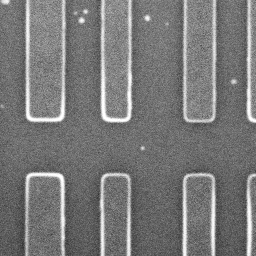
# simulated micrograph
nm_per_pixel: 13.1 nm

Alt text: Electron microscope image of groups of lines, slits or small figures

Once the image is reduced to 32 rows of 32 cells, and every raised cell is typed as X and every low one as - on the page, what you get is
---XXXXX-----XXX-------XXXX----X
---XXXXX-----XXX-------XXXX----X
---XXXXX-----XXX-------XXXX----X
---XXXXX-----XXX-------XXXX----X
---XXXXX-----XXX-------XXXX----X
---XXXXX-----XXX-------XXXX----X
---XXXXX-----XXX-------XXXX----X
---XXXXX-----XXX-------XXXX----X
---XXXXX-----XXX-------XXXX----X
---XXXXX-----XXX-------XXXX----X
---XXXXX-----XXX-------XXXX----X
---XXXXX-----XXX-------XXXX----X
---XXXXX-----XXX-------XXXX----X
---XXXXX-----XXX-------XXXX----X
---XXXXX-----XXX-------XXXX----X
--------------------------------
--------------------------------
--------------------------------
--------------------------------
--------------------------------
--------------------------------
--------------------------------
---XXXXX-----XXX-------XXXX----X
---XXXXX-----XXX-------XXXX----X
---XXXXX-----XXX-------XXXX----X
---XXXXX-----XXX-------XXXX----X
---XXXXX-----XXX-------XXXX----X
---XXXXX-----XXX-------XXXX----X
---XXXXX-----XXX-------XXXX----X
---XXXXX-----XXX-------XXXX----X
---XXXXX-----XXX-------XXXX----X
---XXXXX-----XXX-------XXXX----X